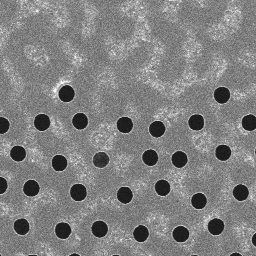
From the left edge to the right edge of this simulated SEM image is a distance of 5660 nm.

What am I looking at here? a regular array of holes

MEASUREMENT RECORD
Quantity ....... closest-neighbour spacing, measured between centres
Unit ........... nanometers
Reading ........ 793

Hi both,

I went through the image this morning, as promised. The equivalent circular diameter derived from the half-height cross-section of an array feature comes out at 368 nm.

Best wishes